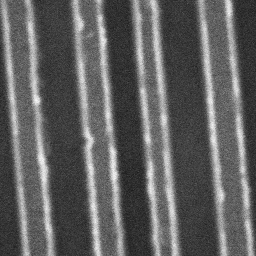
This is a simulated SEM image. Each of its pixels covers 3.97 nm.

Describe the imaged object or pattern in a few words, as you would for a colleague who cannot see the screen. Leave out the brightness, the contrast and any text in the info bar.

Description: one or a few lines or trenches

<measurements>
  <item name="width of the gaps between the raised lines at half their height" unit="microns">0.174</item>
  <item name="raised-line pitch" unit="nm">262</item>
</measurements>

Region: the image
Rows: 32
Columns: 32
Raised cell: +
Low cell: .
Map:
++++.....++++....++......++++...
++++.....++++....+++.....++++...
.+++.....++++....+++.....++++...
.+++......+++....+++.....++++...
.+++......+++....+++.....++++...
.+++......+++....+++......+++...
.+++......+++....+++......+++...
.+++......+++....+++......+++...
.+++......+++....+++......+++...
.+++......+++.....++......++++..
.+++......+++.....++......++++..
.++++.....++++....++......++++..
.++++.....++++....++......++++..
.++++.....++++....++......++++..
..+++......+++....+++.....++++..
..+++......+++....+++.....++++..
..+++......+++....+++......+++..
..+++......+++....+++.....++++..
..+++......+++....+++......+++..
..+++......+++....+++......+++..
..++++.....++++....++......++++.
..++++.....++++...+++......++++.
..++++.....++++....++......++++.
..++++.....++++...+++......++++.
..++++.....++++....++......++++.
...+++.....++++....+++.....++++.
...+++......+++....+++.....++++.
...+++......+++....+++......+++.
...+++......+++....+++......+++.
...+++......+++....+++......+++.
...+++......+++....+++......+++.
...++++.....+++.....++......++++